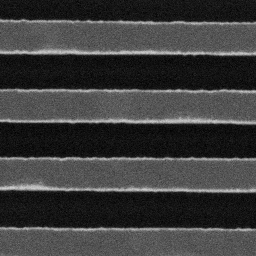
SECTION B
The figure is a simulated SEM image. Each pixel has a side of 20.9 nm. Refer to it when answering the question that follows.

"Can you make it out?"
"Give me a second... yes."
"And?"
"lines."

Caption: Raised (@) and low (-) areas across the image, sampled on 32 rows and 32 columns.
--------------------------------
--------------------------------
@@@-----------------------------
@@@@@@@@@@@@@@@@@@@@@@@@@@@@@@@@
@@@@@@@@@@@@@@@@@@@@@@@@@@@@@@@@
@@@@@@@@@@@@@@@@@@@@@@@@@@@@@@@@
@@@@@@@@@@@@@@@@@@@@@@@@@@@@@@@@
--------------------------------
--------------------------------
--------------------------------
--------------------------------
@@@@@@@@@@@@@@@@@@@@@@@@@@@@@@@@
@@@@@@@@@@@@@@@@@@@@@@@@@@@@@@@@
@@@@@@@@@@@@@@@@@@@@@@@@@@@@@@@@
@@@@@@@@@@@@@@@@@@@@@@@@@@@@@@@@
--------------------------------
--------------------------------
--------------------------------
--------------------------------
--------------------------------
@@@@@@@@@@@@@@@@@@@@@@@@@@@@@@@@
@@@@@@@@@@@@@@@@@@@@@@@@@@@@@@@@
@@@@@@@@@@@@@@@@@@@@@@@@@@@@@@@@
@@@@@@@@@@@@@@@@@@@@@@@@@@@@@@@@
--------------------------------
--------------------------------
--------------------------------
--------------------------------
@@-@@@@-----@-------------------
@@@@@@@@@@@@@@@@@@@@@@@@@@@@@@@@
@@@@@@@@@@@@@@@@@@@@@@@@@@@@@@@@
@@@@@@@@@@@@@@@@@@@@@@@@@@@@@@@@